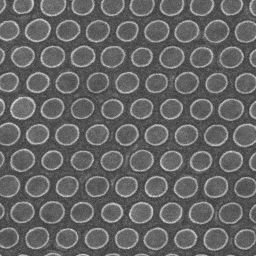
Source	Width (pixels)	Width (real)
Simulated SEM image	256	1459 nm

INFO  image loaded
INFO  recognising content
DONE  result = a regular array of raised bodies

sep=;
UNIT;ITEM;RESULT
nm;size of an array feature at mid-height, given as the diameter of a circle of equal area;121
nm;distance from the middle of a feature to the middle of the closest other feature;168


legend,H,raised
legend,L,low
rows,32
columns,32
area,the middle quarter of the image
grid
LLLHHHLLLLHHHLLLLLLLLLLLLHHHLLLL
LLLLLLLLLLLLLLLLLLLLLLLLLLLLLLLL
HHHLLLLHHHLLLLLHHLLLLLLLLLLLLLHH
HHHLLLHHHHHLLLHHHHLLLHHHHHLLHHHH
HHHHLLHHHHHLLHHHHHHLLHHHHHLLHHHH
HHHLLLHHHHHLLHHHHHLLLHHHHHLLHHHH
HHHLLLHHHHLLLLHHHHLLLHHHHLLLHHHH
LLLLLLLLLLLLLLLLLLLLLLLLLLLLLLLL
LLLLLLLLLLLLLLLLLLLLLLLLLLLLLLLL
LLLHHHHLLLLHHHLLLLHHHHLLLHHHHLLL
LLHHHHHLLLHHHHHLLHHHHHLLHHHHHLLL
LLHHHHHLLLHHHHHLLHHHHHLLHHHHHLLL
LLHHHHHLLLHHHHLLLHHHHHLLHHHHHLLL
LLLLHLLLLLLLLLLLLLLHLLLLLHHHLLLL
LLLLLLLLLLLLLLLLLLLLLLLLLLLLLLLL
HHLLLLLLHHLLLLLHHLLLLLHHHLLLLLHH
HHHHLLHHHHHLLHHHHHLLLHHHHHLLHHHH
HHHHLLHHHHHLLHHHHHLLLHHHHHLLHHHH
HHHLLLHHHHHLLHHHHHLLLHHHHHLLHHHH
HHLLLLHHHHLLLLHHHLLLLHHHHLLLHHHH
LLLLLLLLLLLLLLLLLLLLLLLLLLLLLLLL
LLLLLLLLLLLLLLLLLLLLLLLLLLLLLLLL
LLLHHHHLLLHHHHLLLLHHHHLLLHHHHLLL
LLHHHHHLLLHHHHHLLHHHHHLLHHHHHLLL
LLHHHHHLLLHHHHLLLHHHHHLLHHHHHLLL
LLHHHHLLLLHHHHLLLHHHHHLLHHHHHLLL
LLLLLLLLLLLHLLLLLLHHLLLLLLHHLLLL
LLLLLLLLLLLLLLLLLLLLLLLLLLLLLLLL
HHLLLLLHHHLLLLLLLLLLLLHHLLLLLLHH
HHHLLLHHHHHLLHHHHHLLLHHHHHLLHHHH
HHHLLLHHHHHLLHHHHHLLHHHHHHLLHHHH
HHHLLLHHHHHLLHHHHHLLHHHHHHLLHHHH